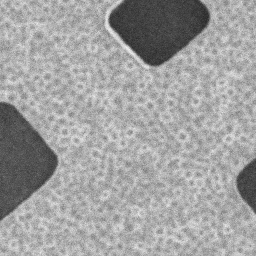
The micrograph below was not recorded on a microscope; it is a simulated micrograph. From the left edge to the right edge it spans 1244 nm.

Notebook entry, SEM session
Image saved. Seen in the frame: holes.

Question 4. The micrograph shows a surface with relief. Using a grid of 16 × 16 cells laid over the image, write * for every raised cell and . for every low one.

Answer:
*******......***
*******......***
********....****
*********..*****
****************
****************
.***************
..**************
...*************
...*************
....***********.
...************.
..*************.
.***************
****************
****************